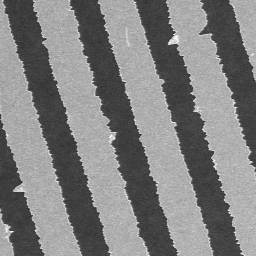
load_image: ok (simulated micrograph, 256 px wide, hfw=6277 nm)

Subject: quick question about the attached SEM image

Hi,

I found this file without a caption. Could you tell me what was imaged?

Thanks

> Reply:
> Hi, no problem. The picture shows parallel lines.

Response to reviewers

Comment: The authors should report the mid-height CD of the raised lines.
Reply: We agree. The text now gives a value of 843 nanometers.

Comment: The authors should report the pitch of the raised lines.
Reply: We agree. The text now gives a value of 1.55 µm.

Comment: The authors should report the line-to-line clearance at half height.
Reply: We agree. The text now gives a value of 696 nm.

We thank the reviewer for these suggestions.